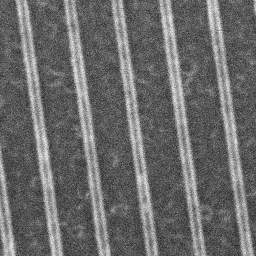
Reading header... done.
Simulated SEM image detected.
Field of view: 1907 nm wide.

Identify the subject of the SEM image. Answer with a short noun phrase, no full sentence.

parallel lines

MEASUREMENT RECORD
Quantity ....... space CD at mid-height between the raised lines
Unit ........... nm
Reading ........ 289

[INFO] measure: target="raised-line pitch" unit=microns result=0.351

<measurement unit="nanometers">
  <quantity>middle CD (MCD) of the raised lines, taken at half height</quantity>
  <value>59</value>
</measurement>